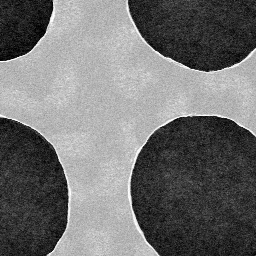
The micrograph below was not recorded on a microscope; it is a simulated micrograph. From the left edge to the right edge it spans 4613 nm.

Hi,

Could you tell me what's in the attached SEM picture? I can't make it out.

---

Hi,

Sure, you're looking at holes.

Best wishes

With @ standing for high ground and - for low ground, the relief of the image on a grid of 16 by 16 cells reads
---@@@@@--------
---@@@@@--------
--@@@@@@@-------
-@@@@@@@@@-----@
@@@@@@@@@@@@@@@@
@@@@@@@@@@@@@@@@
@@@@@@@@@@@@@@@@
-@@@@@@@@@@---@@
---@@@@@@-------
---@@@@@@-------
----@@@@--------
----@@@@--------
----@@@@--------
----@@@@--------
----@@@@@-------
---@@@@@@@------